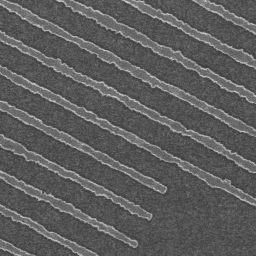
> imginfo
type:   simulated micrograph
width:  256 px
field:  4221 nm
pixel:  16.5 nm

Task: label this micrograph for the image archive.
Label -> parallel lines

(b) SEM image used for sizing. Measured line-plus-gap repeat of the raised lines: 505 nm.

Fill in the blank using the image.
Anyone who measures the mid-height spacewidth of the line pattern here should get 375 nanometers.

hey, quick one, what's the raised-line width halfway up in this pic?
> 0.126 micrometres